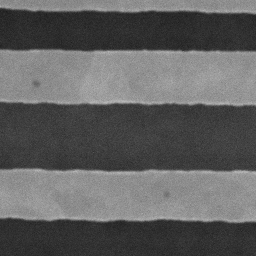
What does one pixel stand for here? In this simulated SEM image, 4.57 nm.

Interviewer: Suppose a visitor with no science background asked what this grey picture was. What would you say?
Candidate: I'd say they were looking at lines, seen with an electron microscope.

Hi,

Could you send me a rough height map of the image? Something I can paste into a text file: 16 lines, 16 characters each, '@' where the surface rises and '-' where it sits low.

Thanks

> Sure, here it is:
@@@@@@@@@@@@@@@@
----------------
----------------
@@@@@@@@@@@@@@@@
@@@@@@@@@@@@@@@@
@@@@@@@@@@@@@@@@
-----------@-@@@
----------------
----------------
----------------
----------------
@@@@@@@@@@@@@@@@
@@@@@@@@@@@@@@@@
@@@@@@@@@@@@@@@@
----------------
----------------